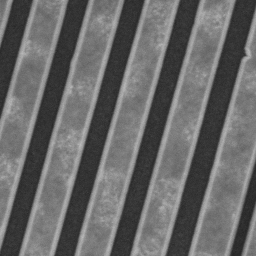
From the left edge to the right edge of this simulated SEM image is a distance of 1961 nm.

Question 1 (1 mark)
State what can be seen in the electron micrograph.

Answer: parallel lines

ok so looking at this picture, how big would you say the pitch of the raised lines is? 417 nanometers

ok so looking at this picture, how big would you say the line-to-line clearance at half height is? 184 nm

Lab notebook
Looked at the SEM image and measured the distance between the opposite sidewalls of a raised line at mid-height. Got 0.23 micrometres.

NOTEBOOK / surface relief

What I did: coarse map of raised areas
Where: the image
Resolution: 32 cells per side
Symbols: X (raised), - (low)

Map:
X---XXXX---XXXX---XXXX---XXXX---
X---XXXX---XXXX---XXXX---XXXX---
X---XXXX---XXXX---XXXX---XXXX---
---XXXX---XXXX---XXXX---XXXX----
---XXXX---XXXX---XXXX---XXXX---X
---XXXX---XXXX---XXXX---XXXX---X
---XXX----XXX----XXX----XXX----X
--XXXX---XXXX---XXXX---XXXX----X
--XXXX---XXXX---XXXX---XXXX---XX
--XXXX---XXXX---XXXX---XXX----XX
-XXXX---XXXX---XXXX---XXXX----XX
-XXXX---XXXX---XXXX---XXXX---XXX
-XXXX---XXXX---XXXX---XXXX---XXX
-XXXX---XXXX---XXXX---XXX----XXX
XXXX---XXXX---XXXX---XXXX----XXX
XXXX---XXXX---XXXX---XXXX---XXXX
XXXX---XXXX---XXXX---XXXX---XXXX
XXXX---XXX----XXX---XXXX----XXXX
XXX---XXXX---XXXX---XXXX---XXXXX
XXX---XXXX---XXXX---XXXX---XXXXX
XXX---XXXX---XXXX---XXXX---XXXXX
XX---XXXX---XXXX---XXXX----XXXX-
XX---XXXX---XXXX---XXXX---XXXXX-
XX---XXXX---XXXX---XXXX---XXXXX-
XX---XXXX---XXX----XXX----XXXX--
X---XXXX---XXXX---XXXX----XXXX--
X---XXXX---XXXX---XXXX---XXXXX--
X---XXXX---XXXX---XXXX---XXXXX--
X---XXX----XXX---XXXX----XXXX--X
---XXXX---XXXX---XXXX----XXXX--X
---XXXX---XXXX---XXXX---XXXXX--X
---XXXX---XXXX---XXXX---XXXXX--X